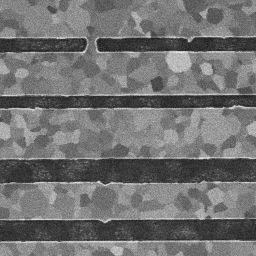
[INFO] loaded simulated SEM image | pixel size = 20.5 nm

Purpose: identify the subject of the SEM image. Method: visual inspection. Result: one or a few lines or trenches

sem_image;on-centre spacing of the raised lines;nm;1310